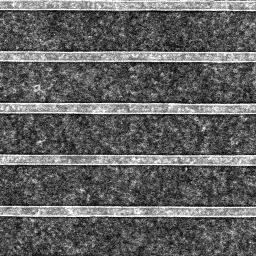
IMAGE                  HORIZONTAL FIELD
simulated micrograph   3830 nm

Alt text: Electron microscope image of parallel lines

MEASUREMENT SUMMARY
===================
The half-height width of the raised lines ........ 144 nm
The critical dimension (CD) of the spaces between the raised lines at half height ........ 0.634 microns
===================